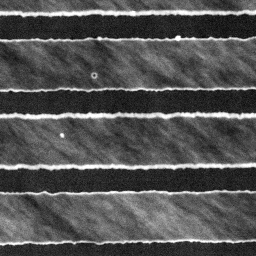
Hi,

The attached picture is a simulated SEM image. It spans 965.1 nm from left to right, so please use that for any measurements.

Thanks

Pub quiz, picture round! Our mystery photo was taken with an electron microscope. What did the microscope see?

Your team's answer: lines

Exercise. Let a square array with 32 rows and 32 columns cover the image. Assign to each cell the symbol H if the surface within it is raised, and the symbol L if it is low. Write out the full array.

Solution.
HHHHHHHHHHHHHHHHHHHHHHHHHHHHHHHH
HHHHHHHHHHHHHHHHHHHHHHHHHHHHHHHH
LLLLLLLLLLLLLLLLLLLLLLLLLLLLLLLL
LLLLLLLLLLLLLLLLLLLLLLLLLLLLLLLL
LLLLLLLLLLLLLLLLLLLLLLLLLLLLLLLL
HHHHHHHHHHHHHHHHHHHHHHHHHHHHHHHH
HHHHHHHHHHHHHHHHHHHHHHHHHHHHHHHH
HHHHHHHHHHHHHHHHHHHHHHHHHHHHHHHH
HHHHHHHHHHHHHHHHHHHHHHHHHHHHHHHH
HHHHHHHHHHHHHHHHHHHHHHHHHHHHHHHH
HHHHHHHHHHHHHHHHHHHHHHHHHHHHHHHH
LLLLLLLLLLLLLLLLLLLLLLLLLLLLLLLL
LLLLLLLLLLLLLLLLLLLLLLLLLLLLLLLL
LLLLLLLLLLLLLLLLLLLLLLLLLLLLLLLL
HHHHLLLHHHHHHHHHHHHHHHHHHHHHHHHH
HHHHHHHHHHHHHHHHHHHHHHHHHHHHHHHH
HHHHHHHHHHHHHHHHHHHHHHHHHHHHHHHH
HHHHHHHHHHHHHHHHHHHHHHHHHHHHHHHH
HHHHHHHHHHHHHHHHHHHHHHHHHHHHHHHH
HHHHHHHHHHHHHHHHHHHHHHHHHHHHHHHH
HHHHHHHHHHHHHHHHHHHHHHHHHHHHHHHH
LLLLLLLLLLLLLLLLLLLLLLLLLLLLLLLL
LLLLLLLLLLLLLLLLLLLLLLLLLLLLLLLL
LLLLLLLLLLLLLLLLLLLLLLLLLLLLLLLL
HHHHHHHHHHHHHHHHHHHHHHHHHHHHHHHH
HHHHHHHHHHHHHHHHHHHHHHHHHHHHHHHH
HHHHHHHHHHHHHHHHHHHHHHHHHHHHHHHH
HHHHHHHHHHHHHHHHHHHHHHHHHHHHHHHH
HHHHHHHHHHHHHHHHHHHHHHHHHHHHHHHH
HHHHHHHHHHHHHHHHHHHHHHHHHHHHHHHH
HLLLLLLLLLLLLLLLLLLLLLLLLLLLLLLL
LLLLLLLLLLLLLLLLLLLLLLLLLLLLLLLL